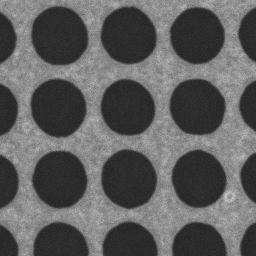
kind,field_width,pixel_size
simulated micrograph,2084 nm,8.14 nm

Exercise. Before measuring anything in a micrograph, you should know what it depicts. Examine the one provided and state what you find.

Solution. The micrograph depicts a regular array of holes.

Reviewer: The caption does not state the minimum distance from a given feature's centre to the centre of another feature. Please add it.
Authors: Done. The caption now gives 0.563 micrometres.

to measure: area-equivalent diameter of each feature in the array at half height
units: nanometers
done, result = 463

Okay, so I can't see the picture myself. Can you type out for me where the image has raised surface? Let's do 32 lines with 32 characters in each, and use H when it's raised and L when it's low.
HHHHHHHHHHHHHHHHHHHHHHHHHHHHHHHH
HHHHHLLLLHHHHHLLLLHHHHHLLLLHHHHL
LHHHLLLLLLHHHLLLLLLHHHLLLLLHHHLL
LLHHLLLLLLLHHLLLLLLHHLLLLLLLHHLL
LLHHLLLLLLLHHLLLLLLLHLLLLLLLHHLL
LLHHLLLLLLLHHLLLLLLLHLLLLLLLHHLL
LLHHLLLLLLLHHLLLLLLHHHLLLLLHHHLL
LHHHHLLLLLHHHHLLLLHHHHHLLLLHHHHL
HHHHHHHHHHHHHHHHHHHHHHHHHHHHHHHH
HHHHHHHHHHHHHHHHHHHHHHHHHHHHHHHH
HHHHHLLLLHHHHHLLLLHHHHLLLLHHHHHL
LHHHLLLLLLHHHLLLLLLHHHLLLLLLHHLL
LLHHLLLLLLLHHLLLLLLHHLLLLLLLHHLL
LLHHLLLLLLLHLLLLLLLHHLLLLLLLHHLL
LLHHLLLLLLLHHLLLLLLHHLLLLLLLHHLL
LLHHHLLLLLHHHLLLLLLHHHLLLLLLHHHL
LHHHHLLLLHHHHHLLLLHHHHHLLLLHHHHH
HHHHHHHHHHHHHHHHHHHHHHHHHHHHHHHH
HHHHHHHHHHHHHHHHHHHHHHHHHHHHHHHH
HHHHHLLLLLHHHHLLLLHHHHHLLLLHHHHL
LLHHHLLLLLHHHLLLLLLHHHLLLLLLHHLL
LLHHLLLLLLLHHLLLLLLHHLLLLLLLHHLL
LLHHLLLLLLLHHLLLLLLLHLLLLLLLHHLL
LLHHLLLLLLLHHLLLLLLLHHLLLLLLHHLL
LLHHHLLLLLHHHLLLLLLHHHLLLLLLHHHL
LHHHHHLLLHHHHHLLLLHHHHHLLLLHHHHH
HHHHHHHHHHHHHHHHHHHHHHHHHHHHHHHH
HHHHHHHHHHHHHHHHHHHHHHHHHHHHHHHH
LHHHHLLLLHHHHHLLLLHHHHHLLLLHHHHL
LLHHHLLLLLHHHLLLLLLHHHLLLLLLHHLL
LLHHLLLLLLLHHLLLLLLLHHLLLLLLHHLL
LLHHLLLLLLLHHLLLLLLLHHLLLLLLHHLL